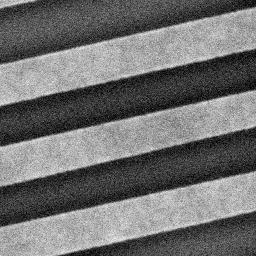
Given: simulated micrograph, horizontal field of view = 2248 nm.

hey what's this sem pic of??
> lines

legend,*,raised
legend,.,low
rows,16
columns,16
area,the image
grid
................
...........*****
.......*********
...***********..
*********.......
*****...........
............****
........********
...**********...
*********.......
*****...........
*............***
........********
...************.
**********......
******..........